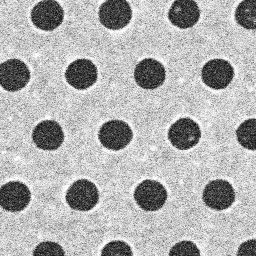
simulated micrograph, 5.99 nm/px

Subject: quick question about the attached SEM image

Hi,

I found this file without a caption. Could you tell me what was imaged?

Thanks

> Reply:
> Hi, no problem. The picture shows a regular array of holes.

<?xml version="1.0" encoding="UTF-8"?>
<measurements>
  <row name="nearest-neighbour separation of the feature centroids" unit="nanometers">408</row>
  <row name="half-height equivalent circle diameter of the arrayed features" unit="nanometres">199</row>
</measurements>